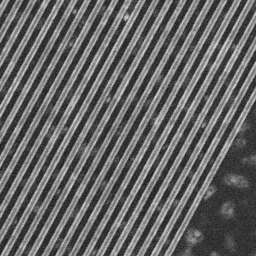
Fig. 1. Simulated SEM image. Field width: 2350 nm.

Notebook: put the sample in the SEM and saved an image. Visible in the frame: parallel lines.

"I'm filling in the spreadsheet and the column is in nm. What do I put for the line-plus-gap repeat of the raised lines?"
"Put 110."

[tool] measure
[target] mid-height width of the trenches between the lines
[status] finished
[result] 63.6 nm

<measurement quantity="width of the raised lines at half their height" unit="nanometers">44.4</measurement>